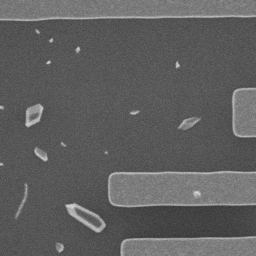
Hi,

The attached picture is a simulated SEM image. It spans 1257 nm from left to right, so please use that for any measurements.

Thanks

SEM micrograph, groups of lines, slits or small figures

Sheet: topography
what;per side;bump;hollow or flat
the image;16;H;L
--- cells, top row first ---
HHHHHHHHHHHHHHHH
LLLLLLLLLLLLLLLL
LLLLLLLLLLLLLLLL
LLLLLLLLLLLLLLLL
LLLLLLLLLLLLLLLL
LLLLLLLLLLLLLLLL
LLLLLLLLLLLLLLLH
LLLLLLLLLLLLLLLH
LLLLLLLLLLLLLLLH
LLLLLLLLLLLLLLLL
LLLLLLLLLLLLLLLL
LLLLLLLHHHHHHHHH
LLLLLLLHHHHHHHHH
LLLLLLLLLLLLLLLL
LLLLLLLLLLLLLLLL
LLLLLLLLHHHHHHHH